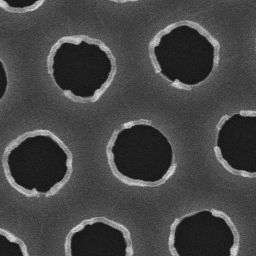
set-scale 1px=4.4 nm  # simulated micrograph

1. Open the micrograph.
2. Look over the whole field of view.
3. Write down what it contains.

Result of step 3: holes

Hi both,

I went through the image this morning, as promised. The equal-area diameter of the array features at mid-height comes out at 0.251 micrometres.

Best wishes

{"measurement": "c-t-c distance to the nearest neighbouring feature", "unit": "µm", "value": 0.461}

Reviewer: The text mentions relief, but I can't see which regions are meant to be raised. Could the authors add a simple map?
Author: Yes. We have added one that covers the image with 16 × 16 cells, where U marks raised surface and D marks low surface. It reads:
UUUUUUUUUUUUUUUU
UUUUUUUUUUUUUUUU
UUUUUUUUUUDDDUUU
UUUDDDDUUUDDDUUU
UUUDDDDUUUDDDUUU
UUUUDDUUUUUUUUUU
UUUUUUUUUUUUUUUU
UUUUUUUUUUUUUUDD
UUDUUUUDDDUUUUDD
UDDDUUUDDDDUUUDD
UDDDUUUDDDDUUUUD
UDDUUUUUUUUUUUUU
UUUUUUUUUUUUUUUU
UUUUUUUUUUUUDDUU
UUUUUDDUUUUDDDUU
DUUUDDDDUUUDDDUU